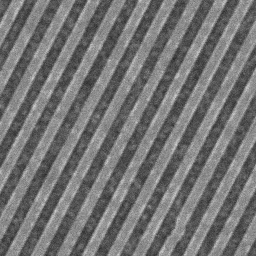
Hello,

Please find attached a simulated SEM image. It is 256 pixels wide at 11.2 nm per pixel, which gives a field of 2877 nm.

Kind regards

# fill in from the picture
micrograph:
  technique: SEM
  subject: parallel lines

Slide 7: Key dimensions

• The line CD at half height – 107 nm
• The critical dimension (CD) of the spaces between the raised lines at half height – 150 nm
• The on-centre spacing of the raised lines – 253 nm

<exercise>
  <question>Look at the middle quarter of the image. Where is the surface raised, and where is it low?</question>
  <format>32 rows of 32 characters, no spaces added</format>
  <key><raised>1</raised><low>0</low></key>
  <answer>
00001110000110000110000111000111
00001100001110001110000110000110
00011100011100001100001110001110
00011000011100011100001100001100
00111000111000011000011100011100
01110000110000111000011000011000
01110001110000110000111000111000
11100001100001110001110000110000
11000011100001100001110001110000
11000011000011100011100001100001
10000111000111000011000011100001
10000110000111000111000011000011
00001110001110000110000111000111
00001100001100001110000110000111
00011100011100001100001110001110
00011000011000011100001100001100
00111000111000011000011100011100
00110000110000111000011000011000
01110001110000110000110000111000
01100001100001110000110000110000
11100011100001100001100001110000
11000011000011100001100001100001
11000111000011000011000011100001
10000110000111000011000011000011
10001110000110000110000111000011
00001100001110000110000110000111
00011100001100001100001110000110
00011000011100011100001100001110
00111000011000011000011100001100
00110000111000111000011000011100
01110001110000110000111000011000
01100001110001110000110000111000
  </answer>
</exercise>